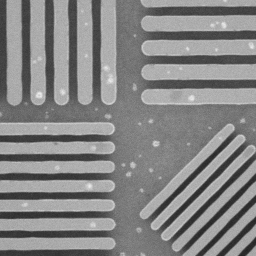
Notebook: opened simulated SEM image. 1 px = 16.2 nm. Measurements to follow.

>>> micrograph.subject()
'groups of lines, slits or small figures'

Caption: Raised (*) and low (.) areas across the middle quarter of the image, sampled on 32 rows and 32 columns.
*..****..****........***********
*..****..****.......************
*..****..****.......************
*..****..****.......************
*..****..****...................
*..****..****...................
*..****..****.......************
*..****..****.......************
*...***..****.......************
*...**....**........************
................................
................................
................................
................................
................................
************....................
************....................
******..****....................
................................
................................
*************...................
************....................
................................
................................
*****.******....................
************...................*
************..................**
.............................***
............................***.
************...............***..
************..............***..*
************.............***..**